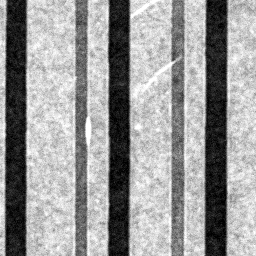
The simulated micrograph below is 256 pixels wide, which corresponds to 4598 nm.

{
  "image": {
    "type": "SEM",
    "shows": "lines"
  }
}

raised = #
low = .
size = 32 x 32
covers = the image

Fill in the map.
#...#########...##########...###
#...#########...##########...###
#...#########...##########...###
#...#########...##########...###
#...#########...##########...###
#...#########...##########...###
#...#########...##########...###
#...#########...##########...###
#..##########...##########...###
#..##########...##########...###
#..##########...##########...###
#..##########...##########...###
#..##########...##########...###
#..##########...##########...###
#..##########...##########...###
#..##########...##########...###
#..##########...##########...###
#..##########...#########....###
#..##########...#########....###
...##########...##########...###
...##########...##########...###
...##########...#########....###
...##########...#########....###
#...#########...#########....###
...##########...#########....###
...##########...#########....###
...##########...#########....###
...##########...#########....###
...##########...#########....###
...##########...#########....###
...##########...#########....###
...##########...#########....###